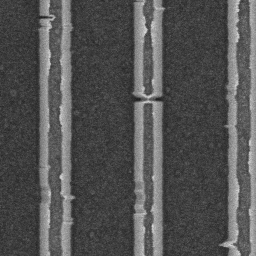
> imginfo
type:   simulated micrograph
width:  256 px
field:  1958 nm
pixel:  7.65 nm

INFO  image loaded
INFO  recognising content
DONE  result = one or a few lines or trenches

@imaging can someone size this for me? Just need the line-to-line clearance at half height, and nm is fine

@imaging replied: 546